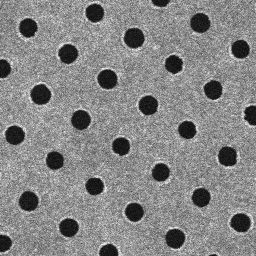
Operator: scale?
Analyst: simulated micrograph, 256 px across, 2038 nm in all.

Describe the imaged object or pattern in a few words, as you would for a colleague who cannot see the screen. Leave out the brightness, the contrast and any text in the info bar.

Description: a regular array of holes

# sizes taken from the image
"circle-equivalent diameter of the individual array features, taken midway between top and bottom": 155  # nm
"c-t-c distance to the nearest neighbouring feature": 377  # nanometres